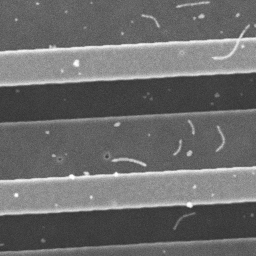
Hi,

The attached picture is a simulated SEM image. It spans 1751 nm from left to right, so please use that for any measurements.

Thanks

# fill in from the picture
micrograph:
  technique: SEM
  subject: lines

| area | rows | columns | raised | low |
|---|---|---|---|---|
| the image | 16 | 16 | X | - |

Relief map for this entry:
XXXXXXXXXXXXXXXX
XXXXXXXXXXXXXXXX
XXXXXXXXXXXXXXXX
XXXXXXXXXXXXXXXX
XXXXXXXXXXXXXXXX
----------------
----------------
----XXXXXXXXXXXX
XXXXXXXXXXXXXXXX
XXXXXXXXXXXXXXXX
XXXXXXXXXXXXXXXX
XXXXXXXXXXXXXXXX
XXXXXXXXXXXXXXXX
----------------
----------------
-----XXXXXXXXXXX